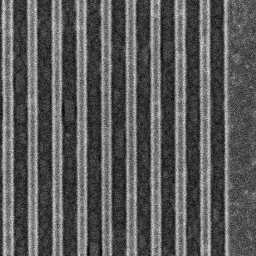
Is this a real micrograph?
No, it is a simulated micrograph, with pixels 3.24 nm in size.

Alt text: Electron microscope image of parallel lines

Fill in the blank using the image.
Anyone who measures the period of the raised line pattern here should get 79.9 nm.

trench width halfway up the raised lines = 0.0511 micrometres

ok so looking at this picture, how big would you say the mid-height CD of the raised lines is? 8.77 pixels